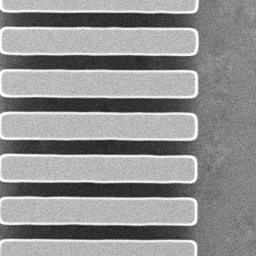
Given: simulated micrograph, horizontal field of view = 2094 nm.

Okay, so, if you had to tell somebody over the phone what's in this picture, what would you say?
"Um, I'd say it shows groups of lines, slits or small figures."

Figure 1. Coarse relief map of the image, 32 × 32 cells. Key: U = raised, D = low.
UUUUUUUUUUUUUUUUUUUUUUUUUDDDDDDD
DDDDDDDDDDDDDDDDDDUUUUUUDDDDDDDD
DDDDDDDDDDDDDDDDDDDDDDDDDDDDDDDD
DUUUUUUUUUUUUUUUDUUDDDDDDDDDDDDD
UUUUUUUUUUUUUUUUUUUUUUUUUDDDDDDD
UUUUUUUUUUUUUUUUUUUUUUUUUDDDDDDD
UUUUUUUUUUUUUUUUUUUUUUUUDDDDDDDD
DDDDDDDDDDDDDDDDDDDDDDDDDDDDDDDD
DDDDDDDDDDDDDDDDDDDDDDDDDDDDDDDD
UUUUUUUUUUUUUUUUUUUUUUUUUDDDDDDD
UUUUUUUUUUUUUUUUUUUUUUUUUDDDDDDD
UUUUUUUUUUUUUUUUUUUUUUUUUDDDDDDD
DDDDDDDDDDDDDDDDDDDDDDDDDDDDDDDD
DDDDDDDDDDDDDDDDDDDDDDDDDDDDDDDD
UUUUUUUUUUUUUUUUUUUUUUUUDDDDDDDD
UUUUUUUUUUUUUUUUUUUUUUUUUDDDDDDD
UUUUUUUUUUUUUUUUUUUUUUUUUDDDDDDD
DDDDDDDDDDDDDDDDDDDDDDDDDDDDDDDD
DDDDDDDDDDDDDDDDDDDDDDDDDDDDDDDD
UUUUUUUUUUUUUUUUUUUDDDDDDDDDDDDD
UUUUUUUUUUUUUUUUUUUUUUUUDDDDDDDD
UUUUUUUUUUUUUUUUUUUUUUUUDDDDDDDD
UUUUUUUUUUUUUUUUUUUUUUUUDDDDDDDD
DDDDDDDDDDDDDDDDDDDDDDDDDDDDDDDD
DDDDDDDDDDDDDDDDDDDDDDDDDDDDDDDD
UUUUUUUUUUUUUUUUUUUUUUUUDDDDDDDD
UUUUUUUUUUUUUUUUUUUUUUUUDDDDDDDD
UUUUUUUUUUUUUUUUUUUUUUUUDDDDDDDD
DDDDDDDDDDDDDDDDDDDDDDDDDDDDDDDD
DDDDDDDDDDDDDDDDDDDDDDDDDDDDDDDD
UUUUUUUUUUUUUUUUUUUUUUUUDDDDDDDD
UUUUUUUUUUUUUUUUUUUUUUUUDDDDDDDD